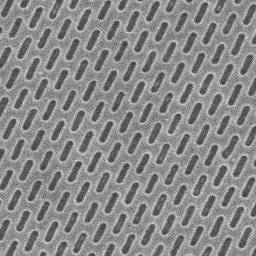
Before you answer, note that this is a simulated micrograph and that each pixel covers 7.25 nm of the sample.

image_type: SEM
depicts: a regular array of holes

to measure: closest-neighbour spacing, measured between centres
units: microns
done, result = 0.159